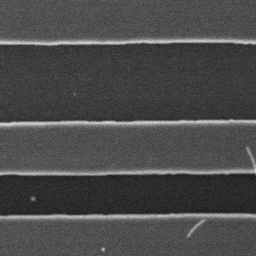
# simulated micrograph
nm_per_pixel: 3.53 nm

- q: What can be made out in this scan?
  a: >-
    lines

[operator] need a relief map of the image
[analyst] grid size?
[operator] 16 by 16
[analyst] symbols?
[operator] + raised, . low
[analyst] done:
++++++++++++++++
++++++++++++++++
++++++++++++++++
................
................
................
................
................
++++++++++++++++
++++++++++++++++
++++++++++++++++
................
................
..++++++++++++++
++++++++++++++++
++++++++++++++++